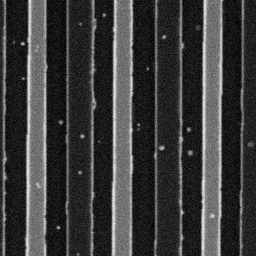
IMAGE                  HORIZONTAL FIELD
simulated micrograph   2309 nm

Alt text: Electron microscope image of lines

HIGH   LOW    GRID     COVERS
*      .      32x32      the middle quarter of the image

.******......****......******...
.******......****......******...
.******......****......******...
.******......****......******...
.******......****......******...
.******......****......******...
.******......****......******...
.******......****......******...
.******......****......******...
.******......****......******...
.******......****......******...
.******......****......******...
.******......****......******...
.******......****......******...
.******......****......******...
.******......****......******...
.******......****......******...
.******......****......******...
.******......****......******...
.******......****......******...
.******......****......******...
.******......****......******...
.******......****......******...
.******......****......******...
.******......****......******...
.******......****......******...
.******......****......******...
.******......****......******...
.******......****......******...
.******.....*****......******...
.******.....*****......******...
.******.....*****......******...